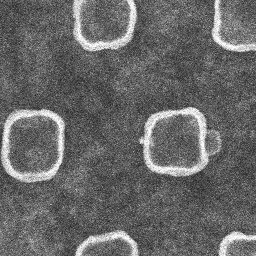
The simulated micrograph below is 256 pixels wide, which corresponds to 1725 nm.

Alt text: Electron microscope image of raised bodies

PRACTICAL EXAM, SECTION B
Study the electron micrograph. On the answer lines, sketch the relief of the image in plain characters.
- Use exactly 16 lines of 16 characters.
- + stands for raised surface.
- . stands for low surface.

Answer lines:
.....+++......++
.....+++.....+++
.....+++......++
................
................
................
................
.+++......+++...
++++.....++++...
++++.....++++...
.+++......++....
................
................
................
................
.....+++......++